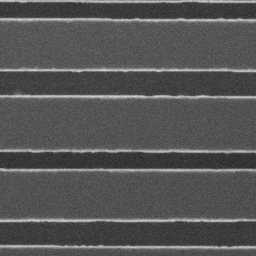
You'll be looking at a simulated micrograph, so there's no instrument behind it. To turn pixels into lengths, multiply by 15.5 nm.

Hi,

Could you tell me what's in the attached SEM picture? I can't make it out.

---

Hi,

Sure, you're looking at lines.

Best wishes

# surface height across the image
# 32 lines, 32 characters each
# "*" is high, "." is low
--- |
................................
................................
********************************
********************************
********************************
********************************
********************************
********************************
********************************
................................
................................
................................
********************************
********************************
********************************
********************************
********************************
********************************
********************************
................................
................................
********************************
********************************
********************************
********************************
********************************
********************************
********************************
................................
................................
................................
********************************